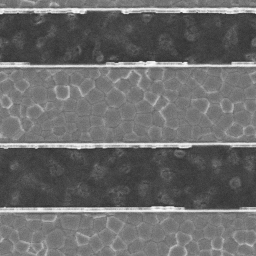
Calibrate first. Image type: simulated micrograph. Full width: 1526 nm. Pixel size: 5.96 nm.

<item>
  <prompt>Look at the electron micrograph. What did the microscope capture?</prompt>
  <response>one or a few lines or trenches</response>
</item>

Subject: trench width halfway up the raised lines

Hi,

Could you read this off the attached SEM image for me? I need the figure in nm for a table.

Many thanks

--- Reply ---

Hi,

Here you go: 464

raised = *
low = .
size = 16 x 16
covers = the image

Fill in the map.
................
****************
****************
****************
................
................
................
................
................
****************
****************
****************
****************
................
................
................